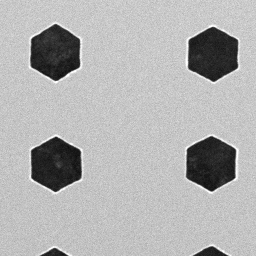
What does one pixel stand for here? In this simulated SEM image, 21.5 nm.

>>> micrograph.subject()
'holes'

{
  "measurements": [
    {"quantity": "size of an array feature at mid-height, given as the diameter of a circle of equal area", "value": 1130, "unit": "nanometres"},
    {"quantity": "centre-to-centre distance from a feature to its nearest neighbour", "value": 2380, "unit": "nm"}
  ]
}